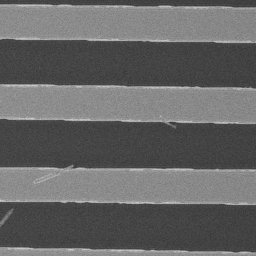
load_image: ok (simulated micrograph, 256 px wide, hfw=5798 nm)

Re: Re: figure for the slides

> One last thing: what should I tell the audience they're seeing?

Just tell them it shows lines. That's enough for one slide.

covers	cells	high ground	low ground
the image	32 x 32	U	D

DDDDDDDDDDDDDDDDDDDDDDDDDDDDDDDD
UUUUUUUUUUUUUUUUUUUUUUUUUUUUUUUU
UUUUUUUUUUUUUUUUUUUUUUUUUUUUUUUU
UUUUUUUUUUUUUUUUUUUUUUUUUUUUUUUU
UUUUUUUUUUUUUUUUUUUUUUUUUUUUUUUU
DDDDDDDDDDDDDDDDDDDDDDDDDDDDDDDD
DDDDDDDDDDDDDDDDDDDDDDDDDDDDDDDD
DDDDDDDDDDDDDDDDDDDDDDDDDDDDDDDD
DDDDDDDDDDDDDDDDDDDDDDDDDDDDDDDD
DDDDDDDDDDDDDDDDDDDDDDDDDDDDDDDD
DDDDDDDDDDDDDDDDDDDDDDDDDDDDDDDD
UUUUUUUUUUUUUUUUUUUUUUUUUUUUUUUU
UUUUUUUUUUUUUUUUUUUUUUUUUUUUUUUU
UUUUUUUUUUUUUUUUUUUUUUUUUUUUUUUU
UUUUUUUUUUUUUUUUUUUUUUUUUUUUUUUU
DDDDDDDDDDDDDDDDDDDDDDDDDDDDDDDD
DDDDDDDDDDDDDDDDDDDDDDDDDDDDDDDD
DDDDDDDDDDDDDDDDDDDDDDDDDDDDDDDD
DDDDDDDDDDDDDDDDDDDDDDDDDDDDDDDD
DDDDDDDDDDDDDDDDDDDDDDDDDDDDDDDD
DDDDDDDDDDDDDDDDDDDDDDDDDDDDDDDD
UUUUUUUUUUUUUUUUUUUUUUUUUUUUUUUU
UUUUUUUUUUUUUUUUUUUUUUUUUUUUUUUU
UUUUUUUUUUUUUUUUUUUUUUUUUUUUUUUU
UUUUUUUUUUUUUUUUUUUUUUUUUUUUUUUU
DDDDDDDDDDDDDDDDDDDDDDDDDDDDUUUU
DDDDDDDDDDDDDDDDDDDDDDDDDDDDDDDD
DDDDDDDDDDDDDDDDDDDDDDDDDDDDDDDD
DDDDDDDDDDDDDDDDDDDDDDDDDDDDDDDD
DDDDDDDDDDDDDDDDDDDDDDDDDDDDDDDD
DDDDDDDDDDDDDDDDDDDDDDDDDDDDDDDD
UUUUUUUUUUUUUUUUUUUUUUUUDDDDDDDD